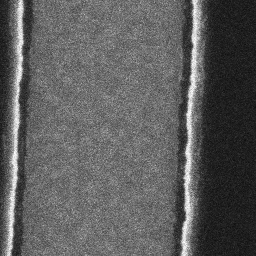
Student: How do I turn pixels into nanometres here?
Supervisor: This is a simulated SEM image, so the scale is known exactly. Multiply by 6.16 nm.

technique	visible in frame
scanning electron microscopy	one or a few lines or trenches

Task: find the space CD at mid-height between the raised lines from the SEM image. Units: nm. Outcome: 1060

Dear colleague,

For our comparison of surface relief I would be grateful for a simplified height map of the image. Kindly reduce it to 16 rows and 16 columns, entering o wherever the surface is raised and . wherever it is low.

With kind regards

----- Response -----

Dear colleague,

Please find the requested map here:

o...........oooo
o...........oooo
o...........oooo
o...........oooo
o...........oooo
o...........oooo
o...........oooo
o...........oooo
o...........oooo
o...........oooo
o...........oooo
o...........oooo
o...........oooo
o...........oooo
o..........ooooo
o..........ooooo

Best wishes